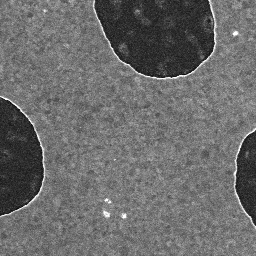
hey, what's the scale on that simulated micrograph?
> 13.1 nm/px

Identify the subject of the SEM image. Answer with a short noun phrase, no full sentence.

holes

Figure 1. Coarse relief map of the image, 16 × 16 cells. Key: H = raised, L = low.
HHHHHHLLLLLLLHHH
HHHHHHLLLLLLLHHH
HHHHHHHLLLLLLHHH
HHHHHHHLLLLLLHHH
HHHHHHHHHLLLHHHH
HHHHHHHHHHHHHHHH
LHHHHHHHHHHHHHHH
LLHHHHHHHHHHHHHH
LLHHHHHHHHHHHHHL
LLLHHHHHHHHHHHHL
LLLHHHHHHHHHHHHL
LLLHHHHHHHHHHHHL
LLHHHHHHHHHHHHHL
HHHHHHHHHHHHHHHH
HHHHHHHHHHHHHHHH
HHHHHHHHHHHHHHHH